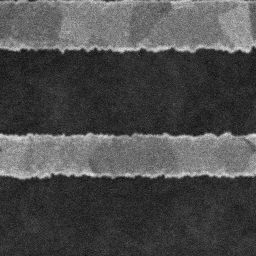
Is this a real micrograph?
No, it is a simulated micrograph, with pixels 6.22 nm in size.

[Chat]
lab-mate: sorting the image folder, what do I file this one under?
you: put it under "one or a few lines or trenches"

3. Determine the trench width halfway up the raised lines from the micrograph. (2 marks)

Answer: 87.4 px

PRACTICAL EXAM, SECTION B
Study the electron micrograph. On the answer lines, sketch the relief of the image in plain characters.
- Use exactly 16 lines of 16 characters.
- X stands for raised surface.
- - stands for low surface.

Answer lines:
XXXXXXXXXXXXXXXX
XXXXXXXXXXXXXXXX
XXXXXXXXXXXXXXXX
----------------
----------------
----------------
----------------
----------------
--X--X--X-----XX
XXXXXXXXXXXXXXXX
XXXXXXXXXXXXXXXX
----------------
----------------
----------------
----------------
----------------